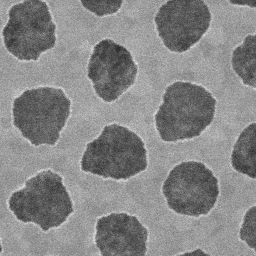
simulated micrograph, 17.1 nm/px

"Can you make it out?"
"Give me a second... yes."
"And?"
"holes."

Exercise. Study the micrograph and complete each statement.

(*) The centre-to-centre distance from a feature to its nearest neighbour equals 1.4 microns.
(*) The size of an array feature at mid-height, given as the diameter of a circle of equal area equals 1000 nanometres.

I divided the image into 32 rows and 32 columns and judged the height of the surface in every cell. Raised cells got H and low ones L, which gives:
HHLLLLHHHHLLLLLHHHHHLLLLLLHHHLLL
HLLLLLHHHHHLLLLHHHHHLLLLLLHHHHHH
HLLLLLLHHHHHHHHHHHHLLLLLLLHHHHHH
LLLLLLLHHHHHHHHHHHHLLLLLLLHHHHHH
LLLLLLLHHHHHHHHHHHHHLLLLLHHHHHHL
LLLLLLLHHHHHLLLHHHHHLLLLHHHHHHLL
HLLLLLHHHHHLLLLLHHHHHHLHHHHHHLLL
HHHLHHHHHHHLLLLLLHHHHHHHHHHHHLLL
HHHHHHHHHHHLLLLLLHHHHHHHHHHHHLLL
HHHHHHHHHHHLLLLLLHHHHHHHHHHHHHLL
HHHHHHHHHHHLLLLLLHHHHLLLHHHHHHHL
HHHLLLLLHHHHLLLLHHHHHLLLLLHHHHHH
HHLLLLLLLHHHHLHHHHHHLLLLLLLHHHHH
HHLLLLLLLHHHHHHHHHHHLLLLLLLHHHHH
HHLLLLLLLHHHHHHHHHHLLLLLLLLHHHHH
HHLLLLLLHHHHHHLHHHHLLLLLLLHHHHHL
HHLLLLLLHHHHHLLLLHHHLLLLLHHHHHLL
HHHLLLLHHHHHLLLLLLHHLLLHHHHHHHLL
HHHHHHHHHHHLLLLLLLHHHHHHHHHHHLLL
HHHHHHHHHHLLLLLLLLHHHHHHHHHHHLLL
HHHHHHHHHHLLLLLLLLHHHHLLLLHHHLLL
HHHHHLLHHHHLLLLLLLHHHLLLLLLHHHLL
HHHLLLLLHHHHHHHHHHHHHLLLLLLHHHHH
HHHLLLLLHHHHHHHHHHHHLLLLLLLHHHHH
HLLLLLLLLHHHHHHHHHHHLLLLLLLHHHHH
HLLLLLLLLHHHHHHHHHHHHLLLLLLHHHHH
HLLLLLLLLHHHHHHHHHHHHHLLLLHHHHHL
HHLLLLLLHHHHLLLLLHHHHHHHHHHHHHLL
HHHHHLLHHHHHLLLLLLHHHHHHHHHHHHLL
HHHHHHHHHHHHLLLLLLLHHHHHHHHHHHLL
HHHHHHHHHHHHLLLLLLHHHHHHHHHHHHHL
HHHHHHHHHHHHLLLLLLHHHHHLLLHHHHHH